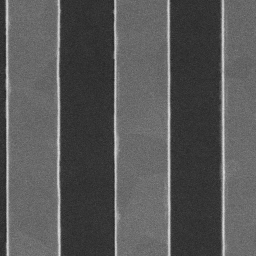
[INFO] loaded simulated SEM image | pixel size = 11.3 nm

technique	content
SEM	one or a few lines or trenches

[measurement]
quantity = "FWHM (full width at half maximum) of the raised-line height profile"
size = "0.594 µm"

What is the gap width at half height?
620 nm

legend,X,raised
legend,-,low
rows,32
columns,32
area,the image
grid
-XXXXXX-------XXXXXXX-------XXXX
-XXXXXX-------XXXXXXX-------XXXX
-XXXXXX-------XXXXXXX-------XXXX
-XXXXXX-------XXXXXXX-------XXXX
-XXXXXX-------XXXXXXX-------XXXX
-XXXXXX-------XXXXXXX-------XXXX
-XXXXXX-------XXXXXXX-------XXXX
-XXXXXX-------XXXXXXX-------XXXX
-XXXXXX-------XXXXXXX-------XXXX
-XXXXXX-------XXXXXXX-------XXXX
-XXXXXX-------XXXXXXX-------XXXX
-XXXXXX-------XXXXXXX-------XXXX
-XXXXXX-------XXXXXXX-------XXXX
-XXXXXX-------XXXXXXX-------XXXX
-XXXXXX-------XXXXXXX-------XXXX
-XXXXXX-------XXXXXXX-------XXXX
-XXXXXX-------XXXXXXX-------XXXX
-XXXXXX-------XXXXXXX-------XXXX
-XXXXXX--------XXXXXX-------XXXX
-XXXXXX-------XXXXXXX-------XXXX
-XXXXXX--------XXXXXX-------XXXX
-XXXXXX--------XXXXXX-------XXXX
-XXXXXX--------XXXXXX-------XXXX
-XXXXXX--------XXXXXX-------XXXX
-XXXXXX-------XXXXXXX-------XXXX
-XXXXXX-------XXXXXXX-------XXXX
-XXXXXX-------XXXXXXX-------XXXX
-XXXXXX--------XXXXXX-------XXXX
-XXXXXX--------XXXXXX-------XXXX
-XXXXXX-------XXXXXXX-------XXXX
-XXXXXX--------XXXXXX-------XXXX
-XXXXXX--------XXXXXX-------XXXX